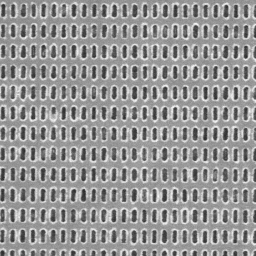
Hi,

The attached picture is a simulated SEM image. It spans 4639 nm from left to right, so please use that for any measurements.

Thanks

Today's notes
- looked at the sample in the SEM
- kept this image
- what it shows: a regular array of holes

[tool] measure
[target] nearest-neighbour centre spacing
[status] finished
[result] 9.96 pixels